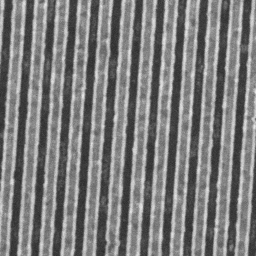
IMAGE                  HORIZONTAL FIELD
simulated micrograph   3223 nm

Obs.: parallel lines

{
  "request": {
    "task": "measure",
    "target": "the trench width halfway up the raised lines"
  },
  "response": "142 nanometres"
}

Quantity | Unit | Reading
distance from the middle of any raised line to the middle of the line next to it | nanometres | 273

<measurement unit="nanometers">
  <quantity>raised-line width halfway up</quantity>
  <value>132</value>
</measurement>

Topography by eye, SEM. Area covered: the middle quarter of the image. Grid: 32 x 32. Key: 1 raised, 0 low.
00011000111000110001110001100011
00011000111001110001110001100011
00011000111000110001110011100011
00011000111000110001110011100011
00111000110000110001110011100011
00111000110001110001100011100011
00111000110001110001100011100011
00111000110001110001100011100111
00111000110001110011100011000111
00111000110001110011100011000111
00111001110001110011100011000111
00111001110001100011100011000111
00110001110001100011100011000111
00110001110001110011100011000111
00110001110001100011100011000111
00110001110001100011100011000111
00110001110011100011100011000110
00110001110011100011000011000110
00110001110001100011000111000110
00110001100011100011000111000110
00110001100011100011000111000110
01110001100011100011000111000110
01110001100011100011000111000110
01110001100011100111000111001110
01110001100011100111000110001110
01110011100011100011000110001110
01110011100011000111000110001110
01100011100011000111000110001100
01100011100011000111000110001110
01100011100011000111000110001110
01100011100011000111000110001110
01100011100111000111000110001100